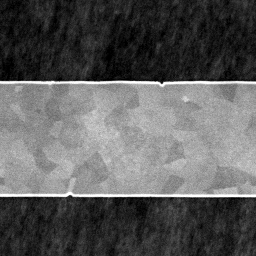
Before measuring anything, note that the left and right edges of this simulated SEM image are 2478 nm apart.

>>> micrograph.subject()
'one or a few lines or trenches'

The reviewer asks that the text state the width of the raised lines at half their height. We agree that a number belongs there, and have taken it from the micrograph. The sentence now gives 1100 nm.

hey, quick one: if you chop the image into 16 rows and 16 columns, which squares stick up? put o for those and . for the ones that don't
................
................
................
................
................
oooooooooooooooo
oooooooooooooooo
oooooooooooooooo
oooooooooooooooo
oooooooooooooooo
oooooooooooooooo
oooooooooooooooo
................
................
................
................